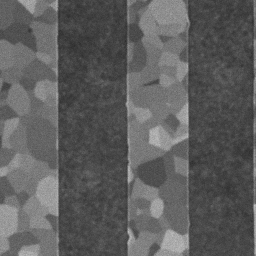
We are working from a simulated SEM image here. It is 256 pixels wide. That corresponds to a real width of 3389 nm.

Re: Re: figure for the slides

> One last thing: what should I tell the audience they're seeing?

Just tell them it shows one or a few lines or trenches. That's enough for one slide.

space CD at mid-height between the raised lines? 911 nm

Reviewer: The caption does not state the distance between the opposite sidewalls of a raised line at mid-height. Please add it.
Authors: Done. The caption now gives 790 nanometers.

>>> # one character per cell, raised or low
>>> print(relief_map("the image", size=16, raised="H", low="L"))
HHHHLLLLHHHHLLLL
HHHHLLLLHHHHLLLL
HHHHLLLLHHHHLLLL
HHHHLLLLHHHHLLLL
HHHHLLLLHHHHLLLL
HHHHLLLLHHHHLLLL
HHHHLLLLHHHHLLLL
HHHHLLLLHHHHLLLL
HHHHLLLLHHHHLLLL
HHHHLLLLHHHHLLLL
HHHHLLLLHHHHLLLL
HHHHLLLLHHHHLLLL
HHHHLLLLHHHHLLLL
HHHHLLLLHHHHLLLL
HHHHLLLLHHHHLLLL
HHHHLLLLHHHHLLLL